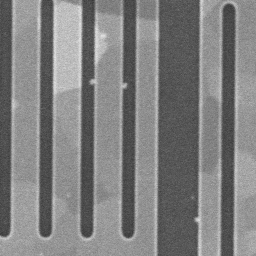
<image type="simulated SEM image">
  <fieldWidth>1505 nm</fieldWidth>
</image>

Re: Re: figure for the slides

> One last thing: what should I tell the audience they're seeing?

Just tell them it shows groups of lines, slits or small figures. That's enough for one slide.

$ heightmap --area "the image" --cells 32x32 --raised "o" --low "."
..ooo..ooo..ooo..ooo.....ooo.ooo
..ooo..ooo..ooo..ooo.....ooo..oo
..ooo..ooo..ooo..ooo.....ooo..oo
..ooo..ooo..ooo..ooo.....ooo..oo
..ooo..ooo..ooo..ooo.....ooo..oo
..ooo..ooo..ooo..ooo.....ooo..oo
..ooo..ooo..ooo..ooo.....ooo..oo
..ooo..ooo..ooo..ooo.....ooo..oo
..ooo..ooo..ooo..ooo.....ooo..oo
..ooo..ooo..ooo..ooo.....ooo..oo
..ooo..ooo..ooo..ooo.....ooo..oo
..ooo..ooo..ooo..ooo.....ooo..oo
..ooo..ooo..ooo..ooo.....ooo..oo
..ooo..ooo..ooo..ooo.....ooo..oo
..ooo..ooo..ooo..ooo.....ooo..oo
..ooo..ooo..ooo..ooo.....ooo.ooo
..ooo..ooo..ooo..ooo.....oo..ooo
..ooo..ooo..ooo..ooo.....oo..ooo
..ooo..ooo..ooo..ooo.....oo..ooo
..ooo..ooo..ooo..ooo.....oo..ooo
..ooo..ooo..ooo..ooo.....oo..ooo
..ooo..ooo..ooo..ooo.....oo..ooo
..ooo..ooo..ooo..ooo.....oo..ooo
..ooo..ooo..ooo..ooo.....oo..ooo
..ooo..ooo..ooo..ooo.....oo..ooo
..ooo..ooo..ooo..ooo.....oo..ooo
..ooo..ooo..ooo..oo......oo..ooo
..ooo..ooo..ooo..oo......oo..ooo
..ooo..ooo..ooo..oo......oo..ooo
.oooo.oooo..ooo..oo......oo..ooo
ooooooooooooooooooo......oo..ooo
ooooooooooooooooooo......oo..ooo